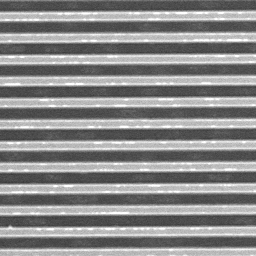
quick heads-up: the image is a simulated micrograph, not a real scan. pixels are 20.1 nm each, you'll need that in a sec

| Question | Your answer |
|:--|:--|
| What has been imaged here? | parallel lines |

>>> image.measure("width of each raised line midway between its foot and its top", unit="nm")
175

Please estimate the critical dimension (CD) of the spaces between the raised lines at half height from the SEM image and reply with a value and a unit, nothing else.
0.248 micrometres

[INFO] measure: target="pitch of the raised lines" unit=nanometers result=432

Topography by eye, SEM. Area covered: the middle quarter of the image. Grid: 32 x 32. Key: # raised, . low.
................................
................................
................................
################################
################################
................................
................................
................................
................................
################################
################################
................................
................................
................................
################################
################################
................................
................................
................................
......##########################
################################
................................
................................
................................
................................
################################
################################
................................
................................
................................
################################
################################